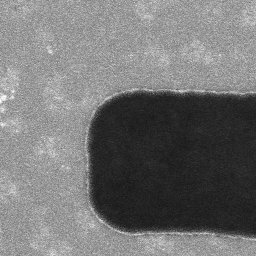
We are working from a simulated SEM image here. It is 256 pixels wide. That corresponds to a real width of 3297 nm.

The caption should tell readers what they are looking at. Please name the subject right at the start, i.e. one or a few lines or trenches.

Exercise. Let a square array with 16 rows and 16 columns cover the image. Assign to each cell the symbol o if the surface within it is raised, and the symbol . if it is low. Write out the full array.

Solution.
................
................
................
................
................
................
......oooooooooo
......oooooooooo
.....ooooooooooo
.....ooooooooooo
.....ooooooooooo
.....ooooooooooo
......oooooooooo
......oooooooooo
.......ooooooooo
................